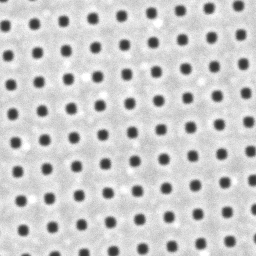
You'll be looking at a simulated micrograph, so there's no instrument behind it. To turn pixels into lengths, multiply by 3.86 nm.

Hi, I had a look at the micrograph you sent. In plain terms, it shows a regular array of holes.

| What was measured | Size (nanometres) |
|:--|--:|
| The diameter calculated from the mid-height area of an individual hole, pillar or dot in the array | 46.3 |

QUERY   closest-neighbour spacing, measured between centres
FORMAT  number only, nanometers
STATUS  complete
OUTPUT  111